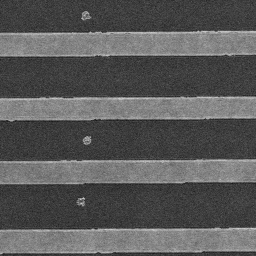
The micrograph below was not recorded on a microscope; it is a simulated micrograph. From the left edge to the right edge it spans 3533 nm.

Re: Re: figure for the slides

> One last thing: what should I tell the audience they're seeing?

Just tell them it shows lines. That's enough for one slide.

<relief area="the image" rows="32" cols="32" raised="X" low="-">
--------------------------------
--------------------------------
--------------------------------
--------------------------------
XXXXXXXXXXXXXXXXXXXXXXXXXXXXXXXX
XXXXXXXXXXXXXXXXXXXXXXXXXXXXXXXX
XXXXXXXXXXXXXXXXXXXXXXXXXXXXXXXX
--------------------------------
--------------------------------
--------------------------------
--------------------------------
--------------------------------
XXXXXXXXXXXXXXXXXXXXXXXXXXXXXXXX
XXXXXXXXXXXXXXXXXXXXXXXXXXXXXXXX
XXXXXXXXXXXXXXXXXXXXXXXXXXXXXXXX
--------------------------------
--------------------------------
--------------------------------
--------------------------------
--------------------------------
XXXXXXXXXXXXXXXXXXXXXXXXXXXXXXXX
XXXXXXXXXXXXXXXXXXXXXXXXXXXXXXXX
XXXXXXXXXXXXXXXXXXXXXXXXXXXXXXXX
--------------------------------
--------------------------------
--------------------------------
--------------------------------
--------------------------------
--------------------------------
XXXXXXXXXXXXXXXXXXXXXXXXXXXXXXXX
XXXXXXXXXXXXXXXXXXXXXXXXXXXXXXXX
XXXXXXXXXXXXXXX-----------------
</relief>